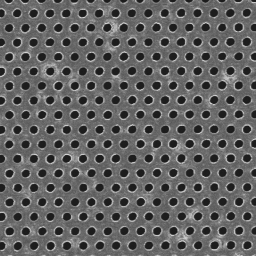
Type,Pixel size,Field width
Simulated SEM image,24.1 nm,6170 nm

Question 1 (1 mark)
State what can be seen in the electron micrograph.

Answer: a regular array of holes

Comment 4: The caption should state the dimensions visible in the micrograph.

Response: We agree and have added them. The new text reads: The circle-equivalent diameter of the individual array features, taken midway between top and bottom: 0.196 µm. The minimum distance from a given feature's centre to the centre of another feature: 16.2 px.